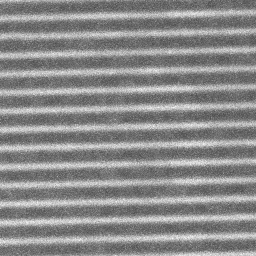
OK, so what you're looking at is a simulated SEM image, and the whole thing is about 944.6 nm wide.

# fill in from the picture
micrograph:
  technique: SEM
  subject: parallel lines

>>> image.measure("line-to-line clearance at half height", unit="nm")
55.3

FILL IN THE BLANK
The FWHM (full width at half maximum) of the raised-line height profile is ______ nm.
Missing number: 12.9